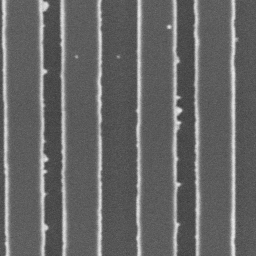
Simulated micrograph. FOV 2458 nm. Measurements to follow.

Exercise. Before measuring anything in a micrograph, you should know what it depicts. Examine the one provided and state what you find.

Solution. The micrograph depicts lines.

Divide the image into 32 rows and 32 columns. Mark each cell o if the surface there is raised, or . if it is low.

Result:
oooooo..oooo.....ooooo..ooooo...
ooooo...oooo.....ooooo..ooooo...
ooooo...oooo.....ooooo..ooooo...
ooooo...oooo.....ooooo..ooooo...
ooooo...ooooo....ooooo..ooooo...
ooooo...ooooo....ooooo..ooooo...
ooooo...ooooo....ooooo..ooooo...
ooooo...ooooo....ooooo..ooooo...
ooooo...oooo.....ooooo..ooooo...
ooooo...ooooo....ooooo..ooooo...
ooooo...oooo.....ooooo..ooooo...
ooooo...ooooo....ooooo..ooooo...
.oooo...oooo.....ooooo..ooooo...
.oooo...oooo.....ooooo..ooooo...
.oooo...ooooo....ooooo...oooo...
.oooo...oooo.....ooooo..ooooo...
.oooo...oooo.....ooooo...oooo...
.oooo...ooooo....ooooo...oooo...
.oooo...ooooo....ooooo...oooo...
.oooo...ooooo....ooooo...oooo...
.oooo...ooooo....ooooo...oooo...
.oooo...ooooo....ooooo...oooo...
.oooo...ooooo....ooooo...oooo...
.oooo...ooooo....ooooo...oooo...
.oooo...ooooo....ooooo...oooo...
.oooo...ooooo....ooooo...oooo...
.oooo...oooo.....ooooo...oooo...
.oooo...ooooo....ooooo...oooo...
.oooo...ooooo....ooooo...oooo...
.ooooo..oooo.....ooooo...oooo...
.oooo...oooo.....ooooo...oooo...
.oooo...oooo.....ooooo...oooo...